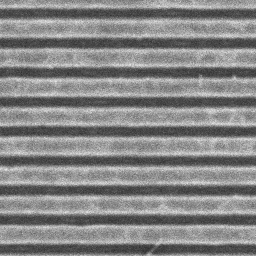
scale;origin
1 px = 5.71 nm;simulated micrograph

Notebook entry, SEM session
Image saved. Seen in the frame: parallel lines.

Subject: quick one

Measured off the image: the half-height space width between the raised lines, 10.9 pixels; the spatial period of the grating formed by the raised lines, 29.4 pixels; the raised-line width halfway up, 108 nm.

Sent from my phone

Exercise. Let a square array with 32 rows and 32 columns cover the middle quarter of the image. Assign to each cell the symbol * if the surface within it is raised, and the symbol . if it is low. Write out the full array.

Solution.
**********..*****************.**
................................
................................
....................***.........
********************************
********************************
********************************
********************************
................................
................................
................................
********************************
********************************
********************************
********************************
.................**.............
................................
................................
********************************
********************************
********************************
********************************
********************************
................................
................................
................................
********************************
********************************
********************************
********************************
................................
................................